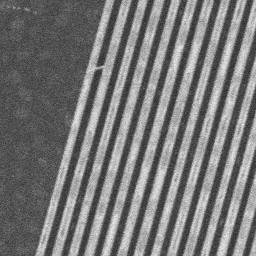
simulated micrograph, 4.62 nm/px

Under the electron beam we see parallel lines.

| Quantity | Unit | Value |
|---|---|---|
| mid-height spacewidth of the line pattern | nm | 35.1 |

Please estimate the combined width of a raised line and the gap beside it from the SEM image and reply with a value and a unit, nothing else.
73.4 nanometers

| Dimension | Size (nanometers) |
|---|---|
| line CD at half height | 39.5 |